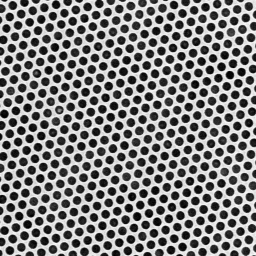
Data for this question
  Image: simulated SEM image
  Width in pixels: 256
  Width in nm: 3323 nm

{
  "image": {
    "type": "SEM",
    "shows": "a regular array of holes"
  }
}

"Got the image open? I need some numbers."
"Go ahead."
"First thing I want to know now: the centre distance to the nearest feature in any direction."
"152 nm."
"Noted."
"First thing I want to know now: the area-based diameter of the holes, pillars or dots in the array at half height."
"121 nanometres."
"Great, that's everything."